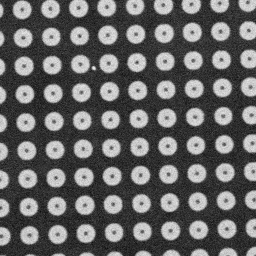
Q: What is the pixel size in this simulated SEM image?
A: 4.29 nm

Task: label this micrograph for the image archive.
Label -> an array of small figures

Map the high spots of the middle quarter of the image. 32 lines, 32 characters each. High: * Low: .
..****...****...****...****...**
..****....***....***....**......
................................
................................
..................*.....***....*
...***....***...****...*****..**
..*****..*****..*****..*****..**
..*****..*****..*****..****....*
..****....***....***....**......
................................
................................
..................*.....***....*
...***....***....****...****...*
..*****..*****..*****..*****...*
..*****..*****...****...****...*
...***....***....***.....**.....
................................
................................
.........................**.....
...***....****...****...****...*
...****...****...****...****...*
...****...****...****...****...*
...****...****...***.....**.....
................................
................................
.........................**.....
...****...****...****...****...*
...****...****...****...****...*
...****...****...****...****...*
...****...****...****....***....
....**..........................
................................